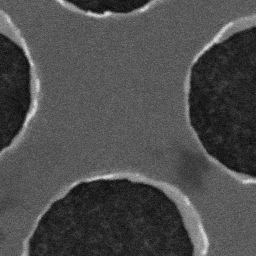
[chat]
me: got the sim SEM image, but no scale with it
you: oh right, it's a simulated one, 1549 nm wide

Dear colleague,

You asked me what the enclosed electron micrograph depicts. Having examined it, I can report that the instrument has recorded holes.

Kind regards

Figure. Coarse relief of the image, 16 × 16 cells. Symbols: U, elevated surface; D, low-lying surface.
UUUUUDDDDUUUUUUU
UUUUUUUUUUUUUUUD
DUUUUUUUUUUUUUDD
DDUUUUUUUUUUUDDD
DDUUUUUUUUUUDDDD
DDUUUUUUUUUUDDDD
DDUUUUUUUUUUDDDD
DDUUUUUUUUUUDDDD
DUUUUUUUUUUUDDDD
UUUUUUUUUUUUUDDD
UUUUUUUUUUUUUUDD
UUUUUDDDDUUUUUUU
UUUUDDDDDDDUUUUU
UUUDDDDDDDDDUUUU
UUDDDDDDDDDDUUUU
UUDDDDDDDDDDUUUU